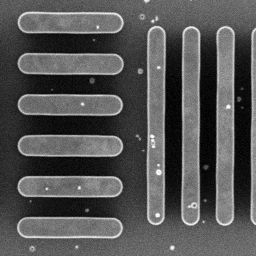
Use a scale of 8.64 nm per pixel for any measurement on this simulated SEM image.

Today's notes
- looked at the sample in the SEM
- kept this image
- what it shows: groups of lines, slits or small figures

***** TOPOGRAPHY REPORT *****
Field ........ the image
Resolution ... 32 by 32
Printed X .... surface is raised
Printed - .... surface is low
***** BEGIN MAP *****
--------------------------------
--------------------------------
--XXXXXXXXXXXXX-----------------
---XXXXXXXXXXXX----X--------X---
-------------------XX--XX--XX---
-------------------XX--XX--XX---
-------------------XX--XX--XX---
--XXXXXXXXXXXXX----XX--XX--XX---
--XXXXXXXXXXXXX----XX--XX--XX---
-------------------XX--XX--XX---
-------------------XX--XX--XX---
-------------------XX--XX--XX---
--XXXXXXXXXXXXX----XX--XX--XX---
--XXXXXXXXXXXXX----XX--XX--XX---
-------------------XX--XX--XX---
-------------------XX--XX--XX--X
-------------------XX--XX--XX--X
---XXXXXXXXXXXX----XX--XX--XX--X
--XXXXXXXXXXXXX----XX--XX--XX--X
------------------XXX--XX--XX--X
------------------XXX--XX--XX--X
------------------XXX--XX--XX--X
---XXXXXXXXXXXX---XXX--XX--XX---
--XXXXXXXXXXXXX---XXX--XX--XX--X
---XXXXXXXXXXX-----XX--XX--XX--X
-------------------XX--XX--XX--X
-------------------XX--XX--XX--X
---XXXXXXXXXXXX----X---XX--XX---
--XXXXXXXXXXXXX-----------------
---XXXXXXXXXXXX-----------------
--------------------------------
--------------------------------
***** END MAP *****